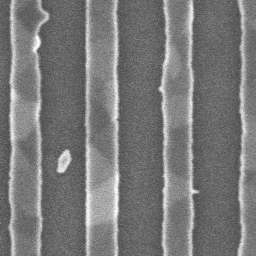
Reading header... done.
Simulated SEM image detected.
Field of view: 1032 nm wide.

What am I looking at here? one or a few lines or trenches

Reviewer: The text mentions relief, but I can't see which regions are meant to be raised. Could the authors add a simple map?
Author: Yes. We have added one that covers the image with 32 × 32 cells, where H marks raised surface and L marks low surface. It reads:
LLHHHLLLLLLHHHHLLLLLLHHHLLLLLLHH
LHHHHHLLLLLHHHLLLLLLLHHHLLLLLLHH
LHHHHHLLLLLHHHLLLLLLLHHHLLLLLLHH
LHHHHLLLLLLHHHHLLLLLLHHHLLLLLLHH
LLHHHLLLLLLHHHHLLLLLLHHHLLLLLLHH
LLHHHLLLLLLHHHHLLLLLLHHHLLLLLLHH
LLHHLLLLLLLHHHHLLLLLLHHHLLLLLLHH
LLHHHLLLLLLHHHHLLLLLLHHHLLLLLLHH
LLHHHLLLLLLHHHLLLLLLLHHHLLLLLLHH
LHHHHLLLLLLHHHLLLLLLHHHHLLLLLLHH
LHHHHLLLLLLHHHHLLLLLHHHHLLLLLLHH
LHHHHLLLLLLHHHHLLLLLHHHHLLLLLLHH
LHHHHLLLLLLHHHHLLLLLHHHHLLLLLLHH
LHHHHLLLLLLHHHHLLLLLHHHHLLLLLLHH
LHHHHLLLLLLHHHHLLLLLHHHHLLLLLLHH
LHHHHLLLLLLHHHHLLLLLLHHHLLLLLLHH
LHHHHLLLLLLHHHHLLLLLLHHHLLLLLLHH
LHHHHLLLLLLHHHHLLLLLLHHHLLLLLLHH
LLHHHLLLLLLHHHHLLLLLHHHHLLLLLLHH
LHHHHLLLHLLHHHHLLLLLHHHHLLLLLLHH
LHHHHLLHLLLHHHHLLLLLLHHHLLLLLLHH
LHHHHLLLLLLHHHHLLLLLLHHHLLLLLLHH
LHHHHLLLLLLHHHHLLLLLLHHHLLLLLLHH
LHHHHLLLLLLHHHHLLLLLLHHHLLLLLLHH
LHHHHLLLLLLHHHHLLLLLLHHHLLLLLLHH
LHHHHLLLLLLHHHHLLLLLLHHHLLLLLLHH
LHHHHLLLLLLHHHHLLLLLLHHHLLLLLLHH
LHHHHLLLLLLHHHHLLLLLLHHHLLLLLLHH
LHHHHLLLLLLHHHHLLLLLHHHHLLLLLLHH
LHHHHLLLLLLHHHHLLLLLHHHHLLLLLLHH
LLHHHLLLLLLHHHHLLLLLHHHHLLLLLLHH
LLHHHLLLLLLHHHHLLLLLLHHHLLLLLLHH